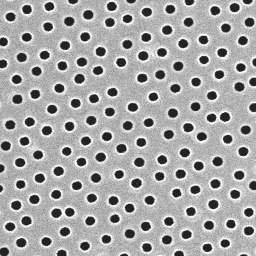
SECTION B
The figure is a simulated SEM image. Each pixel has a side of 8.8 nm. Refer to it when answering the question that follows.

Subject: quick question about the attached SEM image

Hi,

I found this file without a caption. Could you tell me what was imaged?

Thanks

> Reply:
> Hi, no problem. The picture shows a regular array of holes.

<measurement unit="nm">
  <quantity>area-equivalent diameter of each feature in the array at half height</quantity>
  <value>86.9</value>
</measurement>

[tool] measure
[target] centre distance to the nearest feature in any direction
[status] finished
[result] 171 nanometers